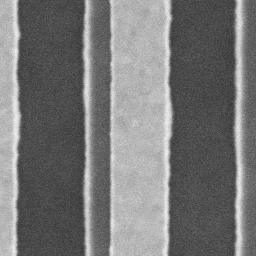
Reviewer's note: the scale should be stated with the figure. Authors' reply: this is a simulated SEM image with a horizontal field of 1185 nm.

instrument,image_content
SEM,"lines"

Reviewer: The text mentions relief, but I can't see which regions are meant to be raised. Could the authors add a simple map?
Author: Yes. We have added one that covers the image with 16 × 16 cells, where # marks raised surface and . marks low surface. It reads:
#....#####.....#
#....######....#
#....#####.....#
#....#####.....#
#....#####.....#
#....#####.....#
#....#####.....#
#....#####.....#
#....#####.....#
#....#####.....#
#....#####.....#
#....#####.....#
#....#####.....#
#....#####.....#
#.....####.....#
#.....####.....#